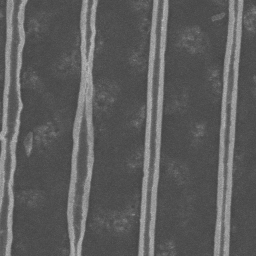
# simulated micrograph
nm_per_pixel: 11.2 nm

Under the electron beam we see one or a few lines or trenches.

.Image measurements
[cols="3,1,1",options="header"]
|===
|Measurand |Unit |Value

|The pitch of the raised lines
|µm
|0.817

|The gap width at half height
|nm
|684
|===